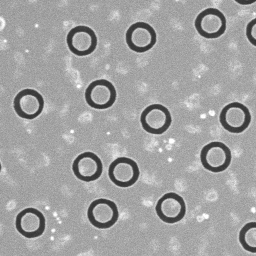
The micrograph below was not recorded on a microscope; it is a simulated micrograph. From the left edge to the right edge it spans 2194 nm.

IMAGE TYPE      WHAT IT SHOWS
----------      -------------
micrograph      a regular array of ring-shaped grooves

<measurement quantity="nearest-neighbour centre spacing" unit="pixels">57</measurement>